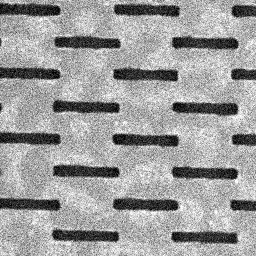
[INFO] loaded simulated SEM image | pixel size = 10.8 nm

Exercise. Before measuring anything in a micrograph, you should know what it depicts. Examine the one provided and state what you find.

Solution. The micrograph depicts a regular array of holes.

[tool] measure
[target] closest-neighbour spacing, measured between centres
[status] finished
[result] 690 nm